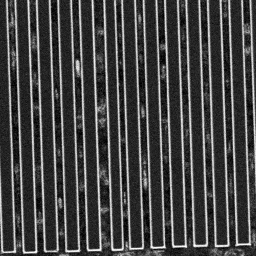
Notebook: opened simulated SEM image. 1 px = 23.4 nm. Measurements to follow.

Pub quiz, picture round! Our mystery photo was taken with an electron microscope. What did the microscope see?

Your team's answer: parallel lines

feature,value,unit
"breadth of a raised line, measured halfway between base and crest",293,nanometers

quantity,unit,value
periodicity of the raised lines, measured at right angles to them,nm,500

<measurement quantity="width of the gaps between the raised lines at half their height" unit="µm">0.202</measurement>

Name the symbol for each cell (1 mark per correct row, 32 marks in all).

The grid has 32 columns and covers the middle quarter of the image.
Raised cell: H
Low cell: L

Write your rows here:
HHLHLHHHLLLHHLLHHHLLHHHLLLHHHLLH
HHLLLHHHLLLHHLLHHHLLHHHHLLHHHLLH
HHLLLHHHLLLHHLLHHHLLHHHHLLHHHLLH
HHLLLHHHLLLHHLLHHHLLHHHHLLHHHLLH
HHLLLHHHLLLHHLLHHHLLHHHHLLHHHLLH
HHLLLHHHLLLHHLLHHHLLLHHHLLHHHLLH
HHLLLHHHLLLHHLLHHHLLLHHHLLHHHLLH
HHLLLHHHLLLHHLLHHHLLLHHHLLHHHLLH
HHLLLHHHLLLHHLLHHHLLLHHHLLHHHLLH
HHLLLHHHLLLHHLLHHHLLLHHHLLHHHLLH
HHLLLHHHLLLHHLLHHHHLLHHHLLHHHLLH
HHLLLHHHLLLHHHLHHHHLLHHHLLHHHLLH
HHHLLHHHLLLHHHLHHHHLLHHHLLHHHLLL
HHHLLHHHLLLHHHLHHHHLLHHHLLHHHLLL
HHHLLHHHLLLHHHLLHHHLLHHHLLHHHLLL
HHHLLHHHLLLHHHLLHHHLLHHHLLHHHLLL
HHHLLHHHLLLHHHLLHHHLLHHHLLHHHHLL
HHHLLHHHLLLHHHLLHHHLLHHHLLHHHHLL
HHHLLHHHLLLHHHLLHHHLLHHHLLHHHHLL
HHHLLHHHLLLHHHLLHHHLLHHHLLHHHHLL
HHHLLHHHLLLHHHLLHHHLLHHHLLLHHHLL
HHHLLHHHLLLHHHLLHHHLLHHHLLLHHHLL
HHHLLHHHLLLHHHLLHHHLLHHHLLLHHHLL
HHHLLHHHLLLHHHLLHHHLLHHHLLLHHHLL
HHHLLHHHLLLHHHLLHHHLLHHHLLLHHHLL
HHHLLHHHLLLHHHLLHHHLLHHHLLLHHHLL
HHHLLHHHLLLHHHLLHHHLLHHHLLLHHHLL
HHHLLHHHHLLHHHLLHHHLLHHHLLLHHHLL
HHHLLHHHHLLHHHLLHHHLLHHHLLLHHHLL
HHHLLHHHHLLLHHLLHHHLLLHHLLLHHHLL
HHHLLHHHHLLLHHLLHHHLLLHHLLLHHHLL
HHHLLLHHHLLLHHLLHHHLLHHHLLLHHHLL